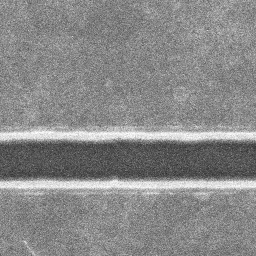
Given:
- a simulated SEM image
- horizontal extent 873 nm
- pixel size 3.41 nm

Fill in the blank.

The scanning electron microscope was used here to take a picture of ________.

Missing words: one or a few lines or trenches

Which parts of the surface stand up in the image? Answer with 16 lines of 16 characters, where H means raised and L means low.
HHHHHHHHHHHHHHHH
HHHHHHHHHHHHHHHH
HHHHHHHHHHHHHHHH
HHHHHHHHHHHHHHHH
HHHHHHHHHHHHHHHH
HHHHHHHHHHHHHHHH
HHHHHHHHHHHHHHHH
HHHHHHHHHHHHHHHH
LLLLLLLLLLLHHLLL
LLLLLLLLLLLLLLLL
LLLLLLLLLLLLLLLL
LLLLLLLLLLLLLLLL
HHHHHHHHHHHHHHHH
HHHHHHHHHHHHHHHH
HHHHHHHHHHHHHHHH
HHHHHHHHHHHHHHHH